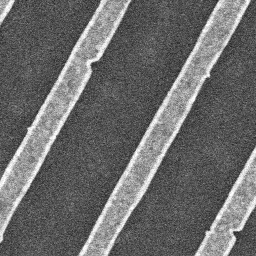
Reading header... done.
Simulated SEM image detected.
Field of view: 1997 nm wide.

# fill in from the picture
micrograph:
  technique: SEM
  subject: one or a few lines or trenches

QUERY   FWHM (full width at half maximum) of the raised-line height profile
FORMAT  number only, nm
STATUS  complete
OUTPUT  186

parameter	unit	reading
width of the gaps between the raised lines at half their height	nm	621